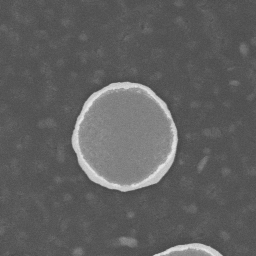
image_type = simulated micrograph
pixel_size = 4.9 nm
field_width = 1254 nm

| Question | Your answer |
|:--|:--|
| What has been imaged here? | raised bodies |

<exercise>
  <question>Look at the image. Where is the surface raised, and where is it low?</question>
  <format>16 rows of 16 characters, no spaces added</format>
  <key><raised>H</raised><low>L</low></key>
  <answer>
LLLLLLLLLLLLLLLL
LLLLLLLLLLLLLLLL
LLLLLLLLLLLLLLLL
LLLLLLLLLLLLLLLL
LLLLLLLLLLLLLLLL
LLLLLLLHHLLLLLLL
LLLLLHHHHHLLLLLL
LLLLLHHHHHHLLLLL
LLLLLHHHHHHLLLLL
LLLLLHHHHHHLLLLL
LLLLLHHHHHLLLLLL
LLLLLLLHHLLLLLLL
LLLLLLLLLLLLLLLL
LLLLLLLLLLLLLLLL
LLLLLLLLLLLLLLLL
LLLLLLLLLLLHHLLL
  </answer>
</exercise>